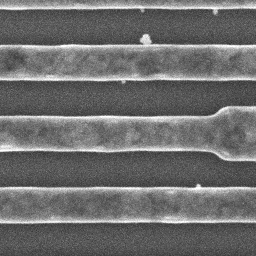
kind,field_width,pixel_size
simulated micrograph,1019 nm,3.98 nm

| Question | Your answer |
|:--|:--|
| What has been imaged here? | wiring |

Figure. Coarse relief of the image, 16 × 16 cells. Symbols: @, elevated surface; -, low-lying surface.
@@@@@@@---@@-@@-
----------------
----------------
@@@@@@@@@@@@@@@@
@@@@@@@@@@@@@@@@
----------------
----------------
@@@@@@@@@@@@@@@@
@@@@@@@@@@@@@@@@
-------------@@@
----------------
----------------
@@@@@@@@@@@@@@@@
@@@@@@@@@@@@@@@@
----------------
----------------